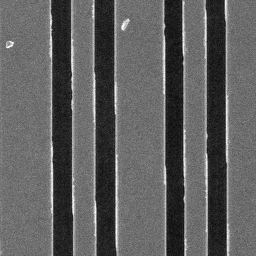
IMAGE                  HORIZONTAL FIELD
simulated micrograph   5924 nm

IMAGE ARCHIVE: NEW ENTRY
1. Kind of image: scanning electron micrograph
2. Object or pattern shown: lines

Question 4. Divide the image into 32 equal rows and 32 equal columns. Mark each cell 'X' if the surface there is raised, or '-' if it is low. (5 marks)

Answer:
XXXXXX---XXX--XXXXXX---XXX--XXXX
XXXXXX---XXX--XXXXXX---XXX--XXXX
XXXXXX---XXX--XXXXXX---XXX--XXXX
XXXXXX---XXX--XXXXXXX--XXX--XXXX
XXXXXX---XXX--XXXXXXX--XXX--XXXX
XXXXXX---XXX--XXXXXXX--XXX--XXXX
XXXXXX---XXX--XXXXXXX--XXX--XXXX
XXXXXX---XXX--XXXXXXX--XXX--XXXX
XXXXXX---XXX--XXXXXXX--XXX--XXXX
XXXXXX---XXX--XXXXXXX--XXX--XXXX
XXXXXX---XXX--XXXXXXX--XXX--XXXX
XXXXXX---XXX--XXXXXXX--XXX--XXXX
XXXXXX---XXX--XXXXXXX--XXX--XXXX
XXXXXX---XXX--XXXXXXX--XXX--XXXX
XXXXXX---XXX--XXXXXXX--XXX--XXXX
XXXXXX---XXX---XXXXXX--XXX--XXXX
XXXXXX---XXX---XXXXXX--XXX--XXXX
XXXXXXX--XXX---XXXXXX--XXX--XXXX
XXXXXXX--XXX---XXXXXX--XXX--XXXX
XXXXXXX--XXX---XXXXXX--XXX--XXXX
XXXXXXX--XXX---XXXXXX--XXX--XXXX
XXXXXXX--XXX---XXXXXX--XXX--XXXX
XXXXXXX--XXX---XXXXXX--XXX--XXXX
XXXXXXX--XXX---XXXXXX--XXX--XXXX
XXXXXXX--XXX---XXXXXX--XXX--XXXX
XXXXXXX--XXX---XXXXXX--XXX--XXXX
XXXXXXX--XXX---XXXXXX--XXX--XXXX
XXXXXXX--XXX---XXXXXX--XXX--XXXX
XXXXXXX--XXX---XXXXXX--XXX--XXXX
XXXXXXX--XXX---XXXXXX--XXX--XXXX
XXXXXXX--XXX---XXXXXX--XXX--XXXX
XXXXXXX--XXX---XXXXXX--XXX--XXXX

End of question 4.